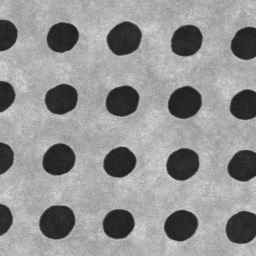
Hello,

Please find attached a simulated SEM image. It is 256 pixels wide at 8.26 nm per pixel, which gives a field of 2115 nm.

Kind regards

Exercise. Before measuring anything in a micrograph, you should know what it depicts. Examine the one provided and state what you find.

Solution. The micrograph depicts a regular array of holes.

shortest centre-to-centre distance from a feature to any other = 507 nanometres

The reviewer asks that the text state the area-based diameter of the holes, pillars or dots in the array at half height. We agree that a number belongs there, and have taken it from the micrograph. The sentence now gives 266 nm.